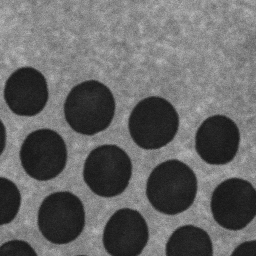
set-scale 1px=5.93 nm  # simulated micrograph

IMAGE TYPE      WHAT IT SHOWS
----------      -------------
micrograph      a regular array of holes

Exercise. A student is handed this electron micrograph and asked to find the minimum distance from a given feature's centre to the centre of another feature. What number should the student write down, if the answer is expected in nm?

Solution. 388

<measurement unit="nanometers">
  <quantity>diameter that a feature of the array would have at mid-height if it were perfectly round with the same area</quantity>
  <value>302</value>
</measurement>